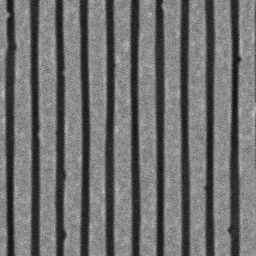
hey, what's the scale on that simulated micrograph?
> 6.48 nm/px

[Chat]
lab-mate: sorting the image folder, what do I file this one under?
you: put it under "parallel lines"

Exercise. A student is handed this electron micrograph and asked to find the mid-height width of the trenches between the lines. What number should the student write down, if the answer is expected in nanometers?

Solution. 53.5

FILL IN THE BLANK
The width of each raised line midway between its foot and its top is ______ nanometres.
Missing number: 108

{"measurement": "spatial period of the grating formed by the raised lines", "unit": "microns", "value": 0.161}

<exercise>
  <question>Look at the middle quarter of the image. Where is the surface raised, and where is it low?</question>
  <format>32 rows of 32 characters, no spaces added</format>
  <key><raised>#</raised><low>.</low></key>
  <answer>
####..####...####..####..####..#
####..####...###...####..####..#
####..####...###...####..####..#
####..####...###...####..####..#
####..####...###...####..####..#
####..####...###...####..####..#
####..####...###...####..####..#
####..####...###...####..####..#
####..####...###...####..####..#
####..####...###...####..####..#
####..####...####..####..####..#
####...###...####..####..####..#
####...###...####..####..####..#
####...###...####..####..####..#
####...####..####..####..####..#
####...###...####..####..####..#
####...###...####..####..####..#
#####..###...####..####..####..#
#####..###...####..####..####..#
#####..###...####..####..####..#
#####..###...####..####..####..#
####...###...####..####..####..#
####...###...####..####..####..#
####...###...####..####..####..#
####..####...####..####..####..#
####..####...####..####..####...
####..####...####..####..####...
####..####...####..####..####...
####..####...####..####..####...
####..####...####..####..####...
####..####...####..####..####...
####..####...####..####..####...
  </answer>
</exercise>